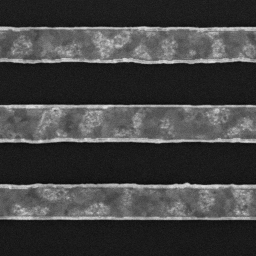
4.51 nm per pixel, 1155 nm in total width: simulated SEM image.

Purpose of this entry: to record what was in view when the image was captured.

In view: one or a few lines or trenches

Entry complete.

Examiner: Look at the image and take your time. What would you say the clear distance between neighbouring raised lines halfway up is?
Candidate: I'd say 197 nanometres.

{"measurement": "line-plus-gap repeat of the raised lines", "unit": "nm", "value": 354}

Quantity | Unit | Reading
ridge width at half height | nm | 155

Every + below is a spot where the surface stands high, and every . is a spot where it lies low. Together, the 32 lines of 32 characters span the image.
................................
................................
................................
++...............++.............
++++++++++++++++++++++++++++++++
++++++++++++++++++++++++++++++++
++++++++++++++++++++++++++++++++
++++++++++++++++++++++++++++++++
................................
................................
................................
................................
................................
++++++++++++++++++++++++++++++++
++++++++++++++++++++++++++++++++
++++++++++++++++++++++++++++++++
++++++++++++++++++++++++++++++++
++++++++++++++++++++++++++++++++
................................
................................
................................
................................
................................
++++++++++++++++++++++++++++++++
++++++++++++++++++++++++++++++++
++++++++++++++++++++++++++++++++
++++++++++++++++++++++++++++++++
................................
................................
................................
................................
................................